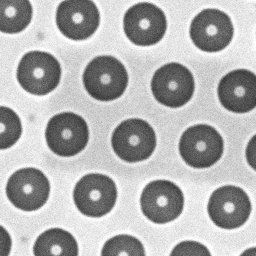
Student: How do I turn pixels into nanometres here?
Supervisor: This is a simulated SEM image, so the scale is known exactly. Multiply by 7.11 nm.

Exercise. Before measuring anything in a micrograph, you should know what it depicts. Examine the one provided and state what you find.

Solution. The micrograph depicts an array of small figures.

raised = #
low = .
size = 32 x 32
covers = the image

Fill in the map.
....###.....#####..#############
.#..###......###.....####...####
....###..#...##......###.....###
...####.....###......###..#..###
########....####....####.....###
#################...####.....###
###...###################..#####
##.....####....#################
##......###.....####...#######.#
##......##......###.....####....
##.....###......###..#..###.....
###...#####.....###.....###..#..
############..#####.....###.....
.####################.######....
..#####...######################
...###.....####....#####..######
...###..#..###.....####....#####
..####.....###..#...##......###.
.#####.....###......##...#..###.
#######..######....####.....###.
#######################....####.
##...###########################
#.....####....#####..###########
#..#..###......###.....####...##
#.....###..#...##......###.....#
#.....###.....###...#..###..#..#
###.######....####.....###.....#
###################...####.....#
.#####.####################...##
.####....#####...###############
..##......###.....####....######
.###......###.....###.....####..